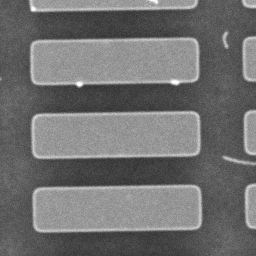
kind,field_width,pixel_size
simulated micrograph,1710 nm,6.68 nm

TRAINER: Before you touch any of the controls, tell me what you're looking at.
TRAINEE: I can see groups of lines, slits or small figures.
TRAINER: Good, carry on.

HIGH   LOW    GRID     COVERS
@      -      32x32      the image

----@@@@@@@@@@@@@@@@@@@@@------@
--------------------------------
--------------------------------
--------------------------------
--------------------------------
----@@@@@@@@@@@@@@@@@@@@@-----@@
----@@@@@@@@@@@@@@@@@@@@@-----@@
----@@@@@@@@@@@@@@@@@@@@@------@
----@@@@@@@@@@@@@@@@@@@@@------@
----@@@@@@@@@@@@@@@@@@@@@------@
-----@@@@@@---------------------
--------------------------------
--------------------------------
--------------------------------
-----@@@@@@@@@@@@@@@@@@@@------@
----@@@@@@@@@@@@@@@@@@@@@------@
----@@@@@@@@@@@@@@@@@@@@@------@
----@@@@@@@@@@@@@@@@@@@@@------@
----@@@@@@@@@@@@@@@@@@@@@------@
-----@@@@@@@@@@@@@@-------------
--------------------------------
--------------------------------
--------------------------------
-----@@@@@@@@@@@@@@@@@@@@------@
----@@@@@@@@@@@@@@@@@@@@@------@
----@@@@@@@@@@@@@@@@@@@@@------@
----@@@@@@@@@@@@@@@@@@@@@------@
----@@@@@@@@@@@@@@@@@@@@@------@
----@@@@@@@@@@@@@@@@@@@@@-------
--------------------------------
--------------------------------
--------------------------------